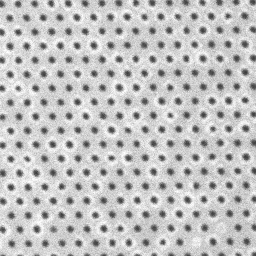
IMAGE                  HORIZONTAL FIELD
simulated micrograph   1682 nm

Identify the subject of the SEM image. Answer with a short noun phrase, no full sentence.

a regular array of holes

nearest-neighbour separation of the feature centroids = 105 nanometres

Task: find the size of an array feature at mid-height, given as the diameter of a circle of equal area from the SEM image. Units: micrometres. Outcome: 0.0497